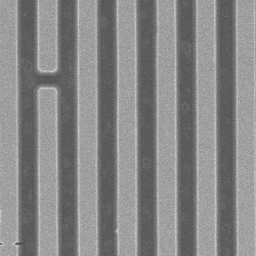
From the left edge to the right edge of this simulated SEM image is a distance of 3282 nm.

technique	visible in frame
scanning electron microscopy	parallel lines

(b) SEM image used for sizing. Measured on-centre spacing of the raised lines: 509 nm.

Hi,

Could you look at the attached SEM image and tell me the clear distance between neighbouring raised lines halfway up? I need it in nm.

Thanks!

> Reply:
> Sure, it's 220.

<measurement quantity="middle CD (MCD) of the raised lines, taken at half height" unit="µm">0.292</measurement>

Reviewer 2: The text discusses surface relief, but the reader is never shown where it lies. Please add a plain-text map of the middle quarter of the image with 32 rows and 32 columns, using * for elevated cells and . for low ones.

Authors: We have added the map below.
...*****.....*****.....*****....
...*****.....*****.....*****....
...*****.....*****.....*****....
...*****.....*****.....*****....
...*****.....*****.....*****....
...*****.....*****.....*****....
...*****.....*****.....*****....
...*****.....*****.....*****....
...******....*****.....*****....
...******....*****.....*****....
...******....*****.....*****....
...******....*****.....*****....
...******....*****.....*****....
...******....*****.....*****....
...******....*****.....*****....
...******....*****.....*****....
...******....*****.....*****....
...******....*****.....*****....
...******....*****.....*****....
...******....*****.....*****....
...******....******....*****....
...******....******....*****....
...******....******....*****....
...******....******....*****....
...******....******....*****....
...******....******....*****....
...******....******....*****....
...******....******....*****....
...******....******....*****....
...******....******....*****....
...******....******....*****....
...******....******....*****....